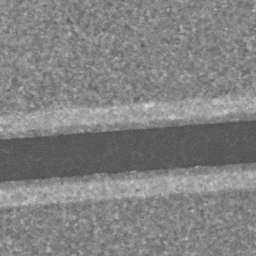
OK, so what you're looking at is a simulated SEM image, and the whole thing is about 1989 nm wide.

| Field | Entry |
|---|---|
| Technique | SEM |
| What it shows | one or a few lines or trenches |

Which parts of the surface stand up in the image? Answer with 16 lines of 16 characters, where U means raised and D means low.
UUUUUUUUUUUUUUUU
UUUUUUUUUUUUUUUU
UUUUUUUUUUUUUUUU
UUUUUUUUUUUUUUUU
UUUUUUUUUUUUUUUU
UUUUUUUUUUUUUUUU
UUUUUUUUUUUUUUUU
UUUDDDDDDDDDDDDD
DDDDDDDDDDDDDDDD
DDDDDDDDDDDDDDDD
DDDDDDDDDDDDDDDD
DDDDDDDDDDDUUUUU
UUUUUUUUUUUUUUUU
UUUUUUUUUUUUUUUU
UUUUUUUUUUUUUUUU
UUUUUUUUUUUUUUUU